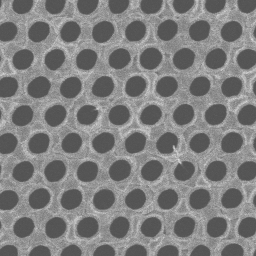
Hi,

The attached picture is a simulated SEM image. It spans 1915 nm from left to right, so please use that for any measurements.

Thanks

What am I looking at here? a regular array of holes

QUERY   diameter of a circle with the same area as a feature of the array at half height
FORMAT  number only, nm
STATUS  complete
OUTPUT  156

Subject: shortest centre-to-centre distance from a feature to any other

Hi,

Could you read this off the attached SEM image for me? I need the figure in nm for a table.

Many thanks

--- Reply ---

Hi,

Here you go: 237